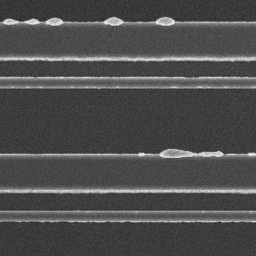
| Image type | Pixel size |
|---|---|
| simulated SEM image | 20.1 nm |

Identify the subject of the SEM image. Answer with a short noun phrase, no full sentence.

lines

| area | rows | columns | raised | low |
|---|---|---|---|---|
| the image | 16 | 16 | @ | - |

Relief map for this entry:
----------------
@@@@@@@@@@@@@@@@
@@@@@@@@@@@@@@@@
@@@@@@@@@@@@@@@@
@@@@@@@@@@@@@@@@
----------------
----------------
----------------
----------------
----------@@----
@@@@@@@@@@@@@@@@
@@@@@@@@@@@@@@@@
@@@@@@@@@@@@@@@@
@@@@@@@@@@@@@@@@
----------------
----------------